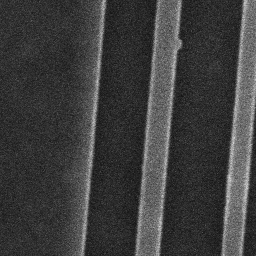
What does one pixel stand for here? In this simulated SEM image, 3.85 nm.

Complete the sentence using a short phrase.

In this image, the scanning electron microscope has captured one or a few lines or trenches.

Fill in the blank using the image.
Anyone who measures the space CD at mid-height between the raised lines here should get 217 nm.